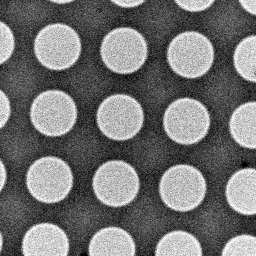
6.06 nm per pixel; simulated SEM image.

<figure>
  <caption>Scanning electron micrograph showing an array of small figures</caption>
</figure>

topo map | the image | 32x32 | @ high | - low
---------------@@-----@@@@----@@
-------------------------------@
--------------------------------
@-----@@@-----------------------
@@---@@@@@---@@@@@----@@@-------
@@--@@@@@@---@@@@@---@@@@@----@@
@---@@@@@@---@@@@@---@@@@@@--@@@
@----@@@@----@@@@@---@@@@@@--@@@
------@@------@@@-----@@@@----@@
-----------------------@@-----@@
--------------------------------
------@-------------------------
@----@@@@----@@@@------@--------
@---@@@@@---@@@@@@---@@@@@----@@
@---@@@@@---@@@@@@---@@@@@---@@@
----@@@@@---@@@@@@---@@@@@---@@@
-----@@@-----@@@@----@@@@@---@@@
----------------------@@@----@@@
--------------------------------
--------------------------------
----@@@@-----@@@----------------
@---@@@@@---@@@@@----@@@@-----@@
@--@@@@@@---@@@@@---@@@@@----@@@
----@@@@@---@@@@@---@@@@@@--@@@@
----@@@@----@@@@@---@@@@@---@@@@
-------------@@@-----@@@@----@@@
------------------------------@@
--------------------------------
----@@@-------------------------
---@@@@@----@@@@-----@@@------@-
---@@@@@---@@@@@@---@@@@@----@@@
---@@@@@---@@@@@@---@@@@@---@@@@